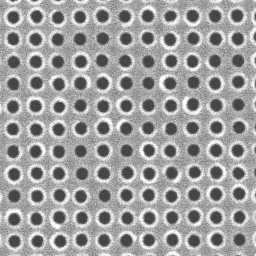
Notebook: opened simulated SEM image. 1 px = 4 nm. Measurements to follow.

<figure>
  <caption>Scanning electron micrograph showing a regular array of holes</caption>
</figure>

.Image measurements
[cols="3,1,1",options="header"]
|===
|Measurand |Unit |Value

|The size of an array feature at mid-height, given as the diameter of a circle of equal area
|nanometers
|49.4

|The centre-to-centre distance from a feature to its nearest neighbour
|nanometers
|87.4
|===